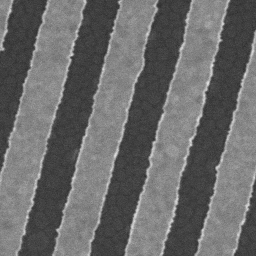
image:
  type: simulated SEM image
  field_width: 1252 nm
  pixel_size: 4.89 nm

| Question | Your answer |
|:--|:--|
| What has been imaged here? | one or a few lines or trenches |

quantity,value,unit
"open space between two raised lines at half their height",164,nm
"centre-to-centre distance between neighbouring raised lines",0.341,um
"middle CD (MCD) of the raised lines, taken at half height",36.1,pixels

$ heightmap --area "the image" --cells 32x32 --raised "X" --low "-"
X-----XXXXX----XXXXX----XXXXX---
X-----XXXX-----XXXX-----XXXX----
X----XXXXX----XXXXX----XXXXX----
X----XXXXX----XXXXX----XXXXX----
X----XXXXX----XXXX-----XXXXX----
----XXXXX-----XXXX-----XXXX-----
----XXXXX----XXXXX-----XXXX-----
----XXXXX----XXXXX----XXXXX----X
----XXXXX----XXXXX----XXXX-----X
---XXXXX-----XXXX-----XXXX-----X
---XXXXX----XXXXX----XXXXX----XX
---XXXXX----XXXXX----XXXXX----XX
---XXXXX----XXXX-----XXXXX----XX
--XXXXX-----XXXX-----XXXX-----XX
--XXXXX----XXXXX----XXXXX----XXX
--XXXXX----XXXXX----XXXXX----XXX
--XXXX-----XXXX-----XXXX-----XXX
-XXXXX----XXXXX----XXXXX----XXXX
-XXXXX----XXXXX----XXXXX----XXXX
-XXXX-----XXXX-----XXXX-----XXXX
-XXXX-----XXXX-----XXXX----XXXXX
XXXXX----XXXXX----XXXXX----XXXXX
XXXXX----XXXXX----XXXX-----XXXXX
XXXX-----XXXX-----XXXX-----XXXX-
XXXX-----XXXX-----XXXX-----XXXX-
XXXX----XXXXX----XXXXX----XXXXX-
XXXX----XXXXX----XXXXX----XXXXX-
XXX-----XXXX-----XXXXX----XXXXX-
XXX----XXXXX----XXXXX----XXXXX--
XXX----XXXXX----XXXXX----XXXXX--
XXX----XXXX-----XXXXX----XXXXX--
XX-----XXXX-----XXXX-----XXXX---